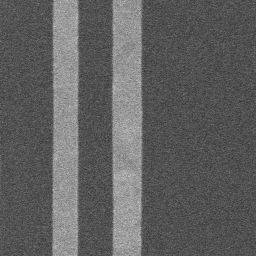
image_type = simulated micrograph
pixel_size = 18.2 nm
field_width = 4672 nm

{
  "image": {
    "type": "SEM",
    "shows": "one or a few lines or trenches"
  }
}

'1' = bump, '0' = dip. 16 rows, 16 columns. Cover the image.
0001100110000000
0001100110000000
0001100110000000
0001100110000000
0001100110000000
0001100110000000
0001100110000000
0001100110000000
0001100110000000
0001100110000000
0001100110000000
0001100110000000
0001100110000000
0001100110000000
0001100110000000
0001100110000000